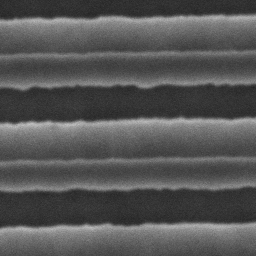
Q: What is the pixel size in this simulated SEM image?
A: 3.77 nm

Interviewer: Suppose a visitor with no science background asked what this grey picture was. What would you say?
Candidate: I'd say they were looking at lines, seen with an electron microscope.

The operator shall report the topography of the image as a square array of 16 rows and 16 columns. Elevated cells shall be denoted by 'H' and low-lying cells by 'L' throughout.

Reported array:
LLLLLLLLLLLLLLLL
HHHHHHHHHHHHHHHH
HHHHHHHHHHHHHHHH
HHHHHHHHHHHHHHHH
HHHHHHHHHHHHHHHH
LLLLLLLLLLLLLLLL
LLLLLLLLLLLLLLLL
LLLLLLLLLHLHHHLH
HHHHHHHHHHHHHHHH
HHHHHHHHHHHHHHHH
HHHHHHHHHHHHHHHH
HHHHHHHHHHHHHHHH
LLLLLLLLLLLLLLLL
LLLLLLLLLLLLLLLL
HHHHHHHHHHHHHHHH
HHHHHHHHHHHHHHHH